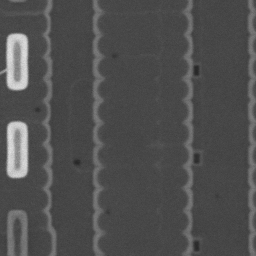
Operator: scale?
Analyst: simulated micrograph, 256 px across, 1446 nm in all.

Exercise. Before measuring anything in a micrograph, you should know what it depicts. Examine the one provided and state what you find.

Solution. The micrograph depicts wiring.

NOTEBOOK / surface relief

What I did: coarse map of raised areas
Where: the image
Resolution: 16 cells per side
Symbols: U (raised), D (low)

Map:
UUUDDDUUUUUUDDDD
UUUDDDUUUUUUDDDD
UUUDDDUUUUUUDDDD
UUUDDDUUUUUUDDDD
UUUDDDUUUUUUDDDD
UUUDDDUUUUUUDDDD
UUUDDDUUUUUUDDDD
UUUDDDUUUUUUDDDD
UUUDDDUUUUUUDDDD
UUUDDDUUUUUUDDDD
UUUDDDUUUUUUDDDD
UUUDDDUUUUUUDDDD
UUUDDDUUUUUUDDDD
UUUDDDUUUUUUDDDD
UUUDDDUUUUUUDDDD
UUUDDDUUUUUUDDDD